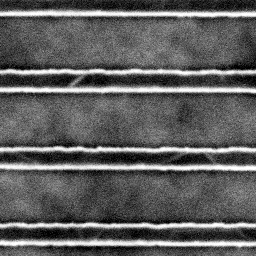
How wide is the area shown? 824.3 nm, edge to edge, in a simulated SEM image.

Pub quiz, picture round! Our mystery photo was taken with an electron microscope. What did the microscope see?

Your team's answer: lines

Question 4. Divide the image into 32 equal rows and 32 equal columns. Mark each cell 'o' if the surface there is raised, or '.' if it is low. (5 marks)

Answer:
oooooooooooooooooooooooooooooooo
oooooooooooooooooooooooooooooooo
................................
................................
................................
................................
................................
................................
................................
oooooooooooooooooooooooooooooooo
oooooooooooooooooooooooooooooooo
................................
................................
................................
................................
................................
................................
................................
......oo.o......................
oooooooooooooooooooooooooooooooo
oooooooooooooooooooooooooooooooo
................................
................................
................................
................................
................................
................................
................................
oooooooooooooooooooooooooooooooo
oooooooooooooooooooooooooooooooo
.....................ooooooooooo
................................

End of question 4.